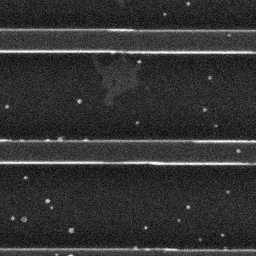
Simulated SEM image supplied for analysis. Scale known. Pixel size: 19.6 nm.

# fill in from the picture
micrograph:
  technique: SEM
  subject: lines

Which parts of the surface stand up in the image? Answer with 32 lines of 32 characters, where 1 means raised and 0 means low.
00000000000000000000000000000000
00000000000000000000000000000000
00000000000000000000000000000000
00000000000000000000000000000000
11111111111111111111111111111111
11111111111111111111111111111111
00000000000000000000001111111111
00000000000000000000000000000000
00000000000000000000000000000000
00000000000000000000000000000000
00000000000000000000000000000000
00000000000000000000000000000000
00000000000000000000000000000000
00000000000000000000000000000000
00000000000000000000000000000000
00000000000000000000000000000000
00000000000000000000000000000000
00000000000000000000000000000000
11111111111111111111111111111111
11111111111111111111111111111111
00000000000000000000000000000000
00000000000000000000000000000000
00000000000000000000000000000000
00000000000000000000000000000000
00000000000000000000000000000000
00000000000000000000000000000000
00000000000000000000000000000000
00000000000000000000000000000000
00000000000000000000000000000000
00000000000000000000000000000000
00000000000000000000000000000000
11111111111111111111111111111111